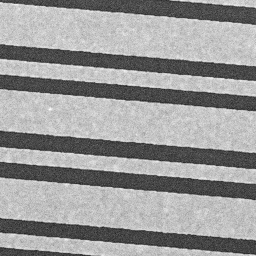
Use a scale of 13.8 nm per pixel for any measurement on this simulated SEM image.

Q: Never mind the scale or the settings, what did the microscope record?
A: lines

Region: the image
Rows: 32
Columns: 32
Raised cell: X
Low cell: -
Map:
XX-------------------------XXXXX
XXXXXXXXXXXXX-------------------
XXXXXXXXXXXXXXXXXXXXXXXXX-------
XXXXXXXXXXXXXXXXXXXXXXXXXXXXXXXX
XXXXXXXXXXXXXXXXXXXXXXXXXXXXXXXX
XXXXXXXXXXXXXXXXXXXXXXXXXXXXXXXX
-----------XXXXXXXXXXXXXXXXXXXXX
X----------------------XXXXXXXXX
XXXXXXXXXXXX--------------------
----XXXXXXXXXXXXXXXXXXXX--------
---------------XXXXXXXXXXXXXXXXX
XXXX-----------------------XXXXX
XXXXXXXXXXXXXXX-----------------
XXXXXXXXXXXXXXXXXXXXXXXXXX------
XXXXXXXXXXXXXXXXXXXXXXXXXXXXXXXX
XXXXXXXXXXXXXXXXXXXXXXXXXXXXXXXX
---XXXXXXXXXXXXXXXXXXXXXXXXXXXXX
-------------XXXXXXXXXXXXXXXXXXX
X-------------------------XXXXXX
XXXXXXXXXXXX--------------------
----XXXXXXXXXXXXXXXXXXX---------
---------------XXXXXXXXXXXXXXXXX
XX------------------------XXXXXX
XXXXXXXXXXXXXX------------------
XXXXXXXXXXXXXXXXXXXXXXXXX-------
XXXXXXXXXXXXXXXXXXXXXXXXXXXXXXXX
XXXXXXXXXXXXXXXXXXXXXXXXXXXXXXXX
----XXXXXXXXXXXXXXXXXXXXXXXXXXXX
---------------XXXXXXXXXXXXXXXXX
XXXX----------------------XXXXXX
XXXXXXXXXXXXXXXX----------------
-------XXXXXXXXXXXXXXXXXXX------